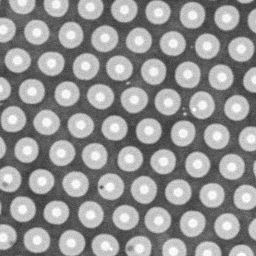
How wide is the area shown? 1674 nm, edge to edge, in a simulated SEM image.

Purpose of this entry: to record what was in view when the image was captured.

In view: an array of small figures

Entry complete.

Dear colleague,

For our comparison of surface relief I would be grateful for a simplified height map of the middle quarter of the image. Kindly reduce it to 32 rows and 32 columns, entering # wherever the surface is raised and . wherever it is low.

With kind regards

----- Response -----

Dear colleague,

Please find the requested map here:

..#######..######...#####....###
..#######..######..######...####
...#####...######..######...####
....###.....####....#####...####
##...................###....####
###....####..................###
####..######....####.....##.....
####..######...######..######...
####..######..#######..######...
###...######..#######..######...
.......####....#####...######..#
...............####....#####....
...##....................##.....
..#####....###..................
.######...#####....#####....###.
.######...######..######...#####
.######..#######..######...#####
..#####...######..######...#####
...........####...######...#####
#...................###....#####
##....####...................#..
###..#####....#####.....##......
###..######...#####...#####.....
##...######...######..######...#
##...#####....######..######..##
......####....#####...######..##
...............###.....####....#
.####......#...................#
######...#####.....##...........
######...######..######....####.
######...######..######...#####.
######...######..######..#######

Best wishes